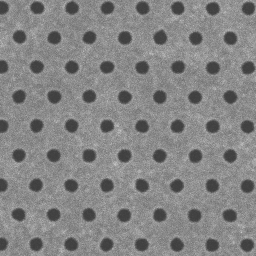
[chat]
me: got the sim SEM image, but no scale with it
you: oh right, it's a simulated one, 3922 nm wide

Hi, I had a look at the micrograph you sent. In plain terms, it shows a regular array of holes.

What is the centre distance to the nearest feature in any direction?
523 nanometers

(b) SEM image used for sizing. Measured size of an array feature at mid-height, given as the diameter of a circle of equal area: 219 nm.